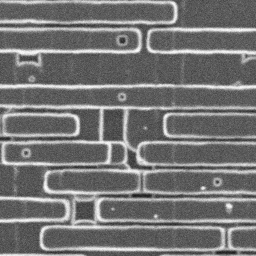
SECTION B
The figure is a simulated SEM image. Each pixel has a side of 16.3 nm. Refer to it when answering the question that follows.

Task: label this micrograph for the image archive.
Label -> wiring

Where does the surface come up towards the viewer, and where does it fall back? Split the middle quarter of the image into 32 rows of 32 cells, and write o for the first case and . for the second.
................................
................................
................................
................................
................................
..........oooooooooooooooooooooo
oooooooooooooooooooooooooooooooo
oooooooooooooooooooooooooooooooo
oooooooooooooo.ooooooooooooooooo
oooooooooooooooooooooooooooooooo
oooooooooooooooooooooooooooooooo
................................
..........................oo....
ooo......................ooooooo
ooo......................ooooooo
ooo......................ooooooo
ooo......................ooooooo
ooo......................ooooooo
................................
oooooo..........................
ooooooooooo........ooooooooooooo
ooooooooooo........ooooooooooooo
ooooooooooo........ooooooooooooo
ooooooooooo........ooooooooooooo
ooooooooooo.........oooooooooooo
................................
................................
ooooooooooooooooooo.oooooooooooo
ooooooooooooooooooo.oooooooooooo
ooooooooooooooooooo.oooooooooooo
ooooooooooooooooooo.oooooooooooo
ooooooooooooooooooo.oooooooooooo